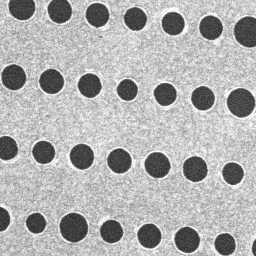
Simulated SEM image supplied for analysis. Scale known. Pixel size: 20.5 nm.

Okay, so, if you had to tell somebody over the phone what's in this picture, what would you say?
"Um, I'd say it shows a regular array of holes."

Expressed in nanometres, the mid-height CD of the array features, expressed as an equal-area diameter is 525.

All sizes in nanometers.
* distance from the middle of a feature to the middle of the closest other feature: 780